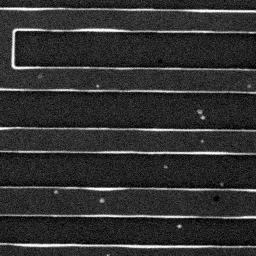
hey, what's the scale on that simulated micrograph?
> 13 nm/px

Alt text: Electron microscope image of groups of lines, slits or small figures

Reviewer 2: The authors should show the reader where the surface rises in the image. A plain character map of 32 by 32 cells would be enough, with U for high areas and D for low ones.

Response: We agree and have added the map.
DDDDDDDDDDDDDDDDDDDDDDDDDDDDDDDD
UUUUUUUUUUUUUUUUUUUUUUUUUUUUUUUU
UUUUUUUUUUUUUUUUUUUUUUUUUUUUUUUU
UUUUUUUUUUUUUUUUUUUUUUUUUUUUUUUU
UUDDDDDDDDDDDDDDDDDDDDDDDDDDDDDD
UUDDDDDDDDDDDDDDDDDDDDDDDDDDDDDD
UUDDDDDDDDDDDDDDDDDDDDDDDDDDDDDD
UUDDDDDDDDDDDDDDDDDDDDDDDDDDDDDD
UUUUUUUUUUUUUUDDDDDDDDDDDDDDDDDD
UUUUUUUUUUUUUUUUUUUUUUUUUUUUUUUU
UUUUUUUUUUUUUUUUUUUUUUUUUUUUUUUU
DDDDDDDDDDDDDDDDDDDDDDDDDDDDDUUU
DDDDDDDDDDDDDDDDDDDDDDDDDDDDDDDD
DDDDDDDDDDDDDDDDDDDDDDDDDDDDDDDD
DDDDDDDDDDDDDDDDDDDDDDDDDDDDDDDD
DDDDDDDDDDDDDDDDDDDDDDDDDDDDDDDD
UUUUUUUUUUUUUUUUUUUUUUUUUUUUUUUU
UUUUUUUUUUUUUUUUUUUUUUUUUUUUUUUU
UUUUUUUUUUUUUUUUUUUUUUUUUUUUUUUU
DDDDDDDDDDDDDDDDDDDDDDDDDDDDDDDD
DDDDDDDDDDDDDDDDDDDDDDDDDDDDDDDD
DDDDDDDDDDDDDDDDDDDDDDDDDDDDDDDD
DDDDDDDDDDDDDDDDDDDDDDDDDDDDDDDD
UUDUUUDDDDDDDDDDDDDDDDDDDDDDDDDD
UUUUUUUUUUUUUUUUUUUUUUUUUUUUUUUU
UUUUUUUUUUUUUUUUUUUUUUUUUUUUUUUU
UUUUUUUUUUUUUUUUUUUUUUUUUUUUUUUU
DDDDDDDDDDDDDDDDDDDDDDDDDDDDDDDD
DDDDDDDDDDDDDDDDDDDDDDDDDDDDDDDD
DDDDDDDDDDDDDDDDDDDDDDDDDDDDDDDD
DDDDDDDDDDDDDDDDDDDDDDDDDDDDDDDD
UUUUUUUUUUUUUUUUUUUUUUUUUUUUUUUU